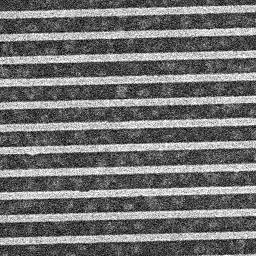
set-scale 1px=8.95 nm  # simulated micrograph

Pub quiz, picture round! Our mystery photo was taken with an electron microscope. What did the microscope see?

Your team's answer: parallel lines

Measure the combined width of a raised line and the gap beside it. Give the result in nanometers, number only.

202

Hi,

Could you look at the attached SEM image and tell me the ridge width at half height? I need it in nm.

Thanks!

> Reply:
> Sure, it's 58.1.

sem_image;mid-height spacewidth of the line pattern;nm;140